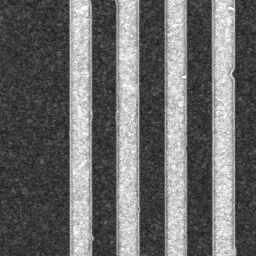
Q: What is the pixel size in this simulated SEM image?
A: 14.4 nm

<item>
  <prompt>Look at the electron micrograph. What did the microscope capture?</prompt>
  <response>parallel lines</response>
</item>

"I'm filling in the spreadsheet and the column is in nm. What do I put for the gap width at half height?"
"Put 303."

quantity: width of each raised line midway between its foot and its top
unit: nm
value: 393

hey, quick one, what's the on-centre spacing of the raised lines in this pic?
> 689 nm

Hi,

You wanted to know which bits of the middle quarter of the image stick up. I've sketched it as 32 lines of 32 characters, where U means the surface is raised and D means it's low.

UUDDDDDUUUUUUDDDDDDUUUUUUDDDDDDU
UUDDDDDUUUUUUDDDDDDUUUUUUDDDDDDU
UUDDDDDUUUUUUDDDDDDUUUUUUDDDDDDU
UUDDDDDUUUUUUDDDDDDUUUUUUDDDDDUU
UUDDDDDUUUUUUDDDDDDUUUUUUDDDDDDU
UUDDDDDUUUUUUDDDDDDUUUUUUDDDDDDU
UUDDDDDUUUUUUDDDDDDUUUUUUDDDDDDU
UUDDDDDUUUUUUDDDDDDUUUUUUDDDDDDU
UUDDDDDUUUUUUDDDDDDUUUUUUDDDDDDU
UUDDDDDUUUUUUDDDDDDUUUUUUDDDDDDU
UUDDDDDUUUUUUDDDDDDUUUUUUDDDDDDU
UUDDDDDUUUUUUDDDDDDUUUUUUDDDDDDU
UUDDDDDUUUUUUDDDDDDUUUUUUDDDDDDU
UUDDDDDUUUUUUDDDDDDUUUUUUDDDDDDU
UUDDDDDUUUUUUDDDDDDUUUUUUDDDDDDU
UUDDDDDUUUUUUDDDDDDUUUUUUDDDDDDU
UUDDDDDUUUUUUDDDDDDUUUUUUDDDDDDU
UUDDDDDUUUUUUDDDDDDUUUUUUDDDDDDU
UUDDDDDUUUUUUDDDDDDUUUUUUDDDDDDU
UUDDDDDUUUUUUDDDDDDUUUUUUDDDDDDU
UUDDDDDUUUUUUDDDDDDUUUUUUDDDDDUU
UUDDDDDUUUUUUDDDDDDUUUUUUDDDDDUU
UUDDDDDUUUUUUDDDDDDUUUUUUDDDDDDU
UUDDDDDUUUUUUDDDDDDUUUUUUDDDDDDU
UUDDDDDUUUUUUDDDDDDUUUUUUDDDDDDU
UUDDDDDUUUUUUDDDDDDUUUUUUDDDDDDU
UUDDDDDUUUUUUDDDDDDUUUUUUDDDDDDU
UUDDDDDUUUUUUDDDDDDUUUUUUDDDDDDU
UUDDDDDUUUUUUDDDDDDUUUUUUDDDDDDU
UUDDDDDUUUUUUDDDDDDUUUUUUDDDDDDU
UUDDDDDUUUUUUDDDDDDUUUUUUDDDDDDU
UUDDDDDUUUUUUDDDDDDUUUUUUDDDDDDU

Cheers